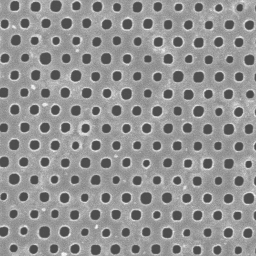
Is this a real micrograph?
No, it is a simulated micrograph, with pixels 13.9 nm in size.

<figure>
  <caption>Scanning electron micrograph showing a regular array of holes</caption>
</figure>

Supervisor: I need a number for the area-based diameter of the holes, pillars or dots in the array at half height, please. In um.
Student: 0.135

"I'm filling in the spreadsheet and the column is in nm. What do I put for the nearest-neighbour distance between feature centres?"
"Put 274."